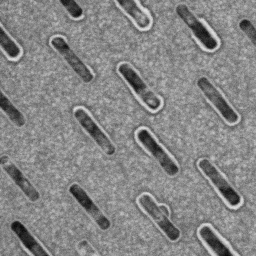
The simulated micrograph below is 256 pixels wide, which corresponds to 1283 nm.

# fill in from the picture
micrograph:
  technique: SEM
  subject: a regular array of holes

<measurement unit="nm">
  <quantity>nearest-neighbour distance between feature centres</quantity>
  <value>342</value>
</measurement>